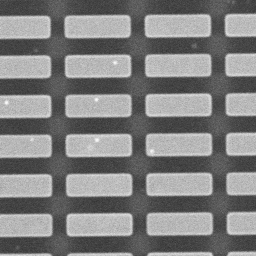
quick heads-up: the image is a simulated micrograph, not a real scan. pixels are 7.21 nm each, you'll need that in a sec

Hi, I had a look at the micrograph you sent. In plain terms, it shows groups of lines, slits or small figures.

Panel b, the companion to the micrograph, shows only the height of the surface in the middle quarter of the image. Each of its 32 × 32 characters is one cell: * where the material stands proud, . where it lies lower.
*****************....***********
.****************....***********
.****************....***********
................................
................................
................................
................................
................................
.****************....***********
.****************....***********
.****************....***********
.****************....***********
.****************....***********
................................
................................
................................
................................
................................
.****************....***********
.****************....***********
.****************....***********
.****************....***********
.****************....***********
................................
................................
................................
................................
......................**********
.****************....***********
.****************....***********
.****************....***********
.****************....***********